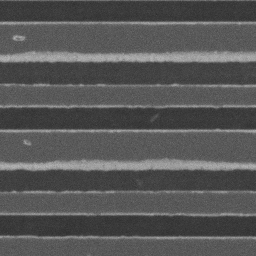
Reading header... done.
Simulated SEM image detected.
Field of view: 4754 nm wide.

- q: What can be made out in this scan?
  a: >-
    lines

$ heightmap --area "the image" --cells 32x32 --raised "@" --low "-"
--------------------------------
--------------------------------
--------------------------------
@@@@@@@@@@@@@@@@@@@@@@@@@@@@@@@@
@@@@@@@@@@@@@@@@@@@@@@@@@@@@@@@@
@@@@@@@@@@@@@@@@@@@@@@@@@@@@@@@@
@@@@@@@@@@@@@@@@@@@@@@@@@@@@@@@@
@-------------------------------
--------------------------------
--------------------------------
--------------------------------
@@@@@@@@@@@@@@@@@@@@@@@@@@@@@@@@
@@@@@@@@@@@@@@@@@@@@@@@@@@@@@@@@
--------------------------------
--------------------------------
--------------------------------
@@@@@@@@@@@@@@@@@@@@@@@@@@@@@@@@
@@@@@@@@@@@@@@@@@@@@@@@@@@@@@@@@
@@@@@@@@@@@@@@@@@@@@@@@@@@@@@@@@
@@@@@@@@@@@@@@@@@@@@@@@@@@@@@@@@
@@@@@@@@@@@@@@@@@@@@@@@@@@@@@@@@
--------------------------------
--------------------------------
--------------------------------
@@@@@@@@@@@@@@@@@@@@@@@@@@@@@@@@
@@@@@@@@@@@@@@@@@@@@@@@@@@@@@@@@
@@@@@@@@@@@@@@@@@@@@@@@@@@@@@@@@
--------------------------------
--------------------------------
--------------------------------
@@@@@@@@@@@@@@@@@@@@@@@@@@@@@@@@
@@@@@@@@@@@@@@@@@@@@@@@@@@@@@@@@